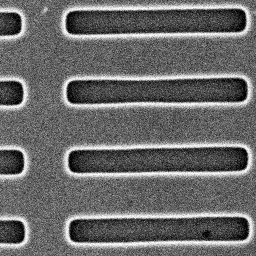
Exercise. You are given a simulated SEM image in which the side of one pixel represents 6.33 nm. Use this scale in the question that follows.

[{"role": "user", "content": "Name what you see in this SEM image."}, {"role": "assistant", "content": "groups of lines, slits or small figures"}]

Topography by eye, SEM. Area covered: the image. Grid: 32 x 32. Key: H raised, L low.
HHHHHHHHHHHHHHHHHHHHHHHHHHHHHHHH
LLHHHHHHHLLLLLLLLLLLLLLLLLLLLLLH
LLLHHHHHLLLLLLLLLLLLLLLLLLLLLLLH
LLLHHHHHLLLLLLLLLLLLLLLLLLLLLLLH
LHHHHHHHHHHHHHHHHHHHHHHHHHHHHHHH
HHHHHHHHHHHHHHHHHHHHHHHHHHHHHHHH
HHHHHHHHHHHHHHHHHHHHHHHHHHHHHHHH
HHHHHHHHHHHHHHHHHHHHHHHHHHHHHHHH
HHHHHHHHHHHHHHHHHHHHHHHHHHHHHHHH
HHHHHHHHHHHHHHHHHHHHHHHHHHHHHHHH
LLLHHHHHHLLLLLLLLLLLLLLLLLLLLLLH
LLLHHHHHLLLLLLLLLLLLLLLLLLLLLLLH
LLLHHHHHLLLLLLLLLLLLLLLLLLLLLLLH
HHHHHHHHHHHHHHHHHHHHHHHHHHHHHHHH
HHHHHHHHHHHHHHHHHHHHHHHHHHHHHHHH
HHHHHHHHHHHHHHHHHHHHHHHHHHHHHHHH
HHHHHHHHHHHHHHHHHHHHHHHHHHHHHHHH
HHHHHHHHHHHHHHHHHHHHHHHHHHHHHHHH
HHHHHHHHHHHHHHHHHLLLLLLLLLLLLLHH
LLLHHHHHHLLLLLLLLLLLLLLLLLLLLLLH
LLLHHHHHLLLLLLLLLLLLLLLLLLLLLLLH
LLLHHHHHHLLLLLLLLLLLLLLLLLLLLLHH
HHHHHHHHHHHHHHHHHHHHHHHHHHHHHHHH
HHHHHHHHHHHHHHHHHHHHHHHHHHHHHHHH
HHHHHHHHHHHHHHHHHHHHHHHHHHHHHHHH
HHHHHHHHHHHHHHHHHHHHHHHHHHHHHHHH
HHHHHHHHHHHHHHHHHHHHHHHHHHHHHHHH
LLHHHHHHHLLLLLLLLLLLLLLLLLLLLLLH
LLLHHHHHHLLLLLLLLLLLLLLLLLLLLLLH
LLLHHHHHHLLLLLLLLLLLLLLLLLLLLLLH
LLHHHHHHHHHLLLLHHHHHHHHHHHHHHHHH
HHHHHHHHHHHHHHHHHHHHHHHHHHHHHHHH